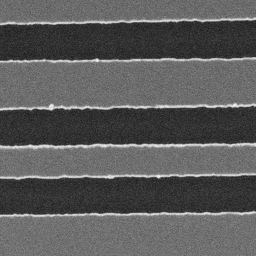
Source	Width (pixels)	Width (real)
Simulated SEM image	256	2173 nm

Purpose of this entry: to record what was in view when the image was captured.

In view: lines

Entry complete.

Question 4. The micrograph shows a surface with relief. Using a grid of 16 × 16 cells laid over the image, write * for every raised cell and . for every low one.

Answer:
****************
**.*............
................
................
****************
****************
****************
................
................
****************
****************
................
................
****************
****************
****************